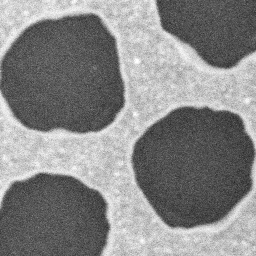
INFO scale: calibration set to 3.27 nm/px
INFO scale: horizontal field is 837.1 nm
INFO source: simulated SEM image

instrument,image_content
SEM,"holes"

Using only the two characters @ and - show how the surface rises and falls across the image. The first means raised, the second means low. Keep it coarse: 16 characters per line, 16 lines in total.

@@@@@@@@@@------
@@-----@@@------
@------@@@@-----
-------@@@@@----
--------@@@@@@@@
--------@@@@@@@@
--------@@@@@@@@
@------@@@-----@
@@@@@@@@@-------
@@@@@@@@--------
@@@@@@@@--------
@----@@@@-------
-------@@------@
-------@@@----@@
-------@@@@@@@@@
-------@@@@@@@@@